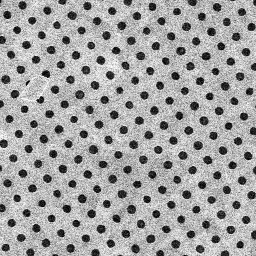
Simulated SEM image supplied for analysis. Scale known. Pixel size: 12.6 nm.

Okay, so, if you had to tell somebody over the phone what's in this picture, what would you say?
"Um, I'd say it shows a regular array of holes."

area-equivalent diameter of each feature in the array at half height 109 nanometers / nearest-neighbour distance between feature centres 222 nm